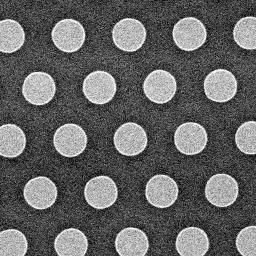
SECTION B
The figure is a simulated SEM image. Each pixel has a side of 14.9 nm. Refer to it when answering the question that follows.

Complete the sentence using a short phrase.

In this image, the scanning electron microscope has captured an array of small figures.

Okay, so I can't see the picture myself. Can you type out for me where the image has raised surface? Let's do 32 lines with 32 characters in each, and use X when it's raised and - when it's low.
--------------------------------
--------------------------------
--------X------XX------XX-----XX
XXX----XXX----XXXX----XXXX---XXX
XXX----XXX----XXXX----XXXX---XXX
XXX----XXX----XXXX----XXX-----XX
--------------------------------
--------------------------------
--------------------------------
----XX-----XXX-----XX-----XXX---
---XXXX---XXXX----XXXX----XXX---
---XXXX---XXXX----XXXX----XXX---
---XXX-----XXX-----XX------X----
--------------------------------
--------------------------------
----------------X------XX-----XX
XXX----XXX-----XXX----XXXX----XX
XXX----XXXX---XXXX----XXXX----XX
XXX----XXXX----XXX----XXX-----XX
-X------X-----------------------
--------------------------------
--------------------------------
----XX-----XXX-----XXX----XXX---
---XXXX----XXXX---XXXX----XXXX--
---XXXX----XXXX---XXXX----XXXX--
----XX-----XXX-----XX------XX---
--------------------------------
--------------------------------
-------------------------------X
XXX----XXXX----XXX----XXXX----XX
XXX----XXXX---XXXX----XXXX----XX
XXX----XXXX----XXX----XXXX----XX